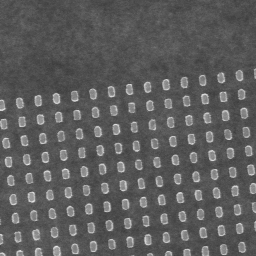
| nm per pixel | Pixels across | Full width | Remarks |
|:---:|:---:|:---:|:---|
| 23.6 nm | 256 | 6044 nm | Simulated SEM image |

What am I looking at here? a regular array of raised bodies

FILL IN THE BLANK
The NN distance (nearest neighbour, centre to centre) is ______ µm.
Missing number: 0.434